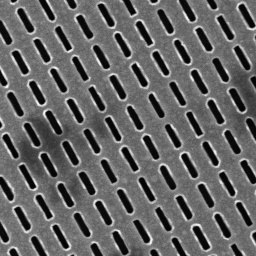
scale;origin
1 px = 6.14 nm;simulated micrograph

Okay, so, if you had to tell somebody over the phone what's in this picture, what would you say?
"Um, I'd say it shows a regular array of holes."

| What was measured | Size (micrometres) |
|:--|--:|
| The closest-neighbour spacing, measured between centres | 0.15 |